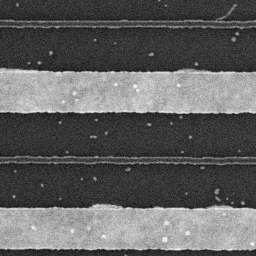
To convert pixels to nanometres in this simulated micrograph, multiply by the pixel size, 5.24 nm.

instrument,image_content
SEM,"lines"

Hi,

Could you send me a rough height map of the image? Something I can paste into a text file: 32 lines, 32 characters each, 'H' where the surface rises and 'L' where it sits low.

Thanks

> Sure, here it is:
LLLLLLLLLLLLLLLLLLLLLLLLLLLLLLLL
LLLLLLLLLLLLLLLLLLLLLLLLLLLLLLLL
LLLLLLLLLLLLLLLLLLLLLLLLLLLLLLLL
LLLLLLLLLLLLLLLLLLLLLLLLLLLLLLHL
LLLLLLLLLLLLLLLLLLLLLLLLLLLLLLLL
LLLLLLLLLLLLLLLLLLLLLLLLLLLLLLLL
LLLLLLLLLLLLLLLLLLLLLLLLLLLLLLLL
LLLLLLLLLLLLLLLLLLLLLLLLLLLLLLLL
LLLLLLLLLLLLLLLLLLLLLLLLLLLLLLLL
HHHHHHHHHHHHHHHHHHHHHHHHHHHHHHHH
HHHHHHHHHHHHHHHHHHHHHHHHHHHHHHHH
HHHHHHHHHHHHHHHHHHHHHHHHHHHHHHHH
HHHHHHHHHHHHHHHHHHHHHHHHHHHHHHHH
HHHHHHHHHHHHHHHHHHHHHHHHHHHHHHHH
LLLLLLLLLLLLLLLLLLLLLLLLLLLLLLLL
LLLLLLLLLLLLLLLLLLLLLLLLLLLLLLLL
LLLLLLLLLLLLLLLLLLLLLLLLLLLLLLLL
LLLLLLLLLLLLLLLLLLLLLLLLLLLLLLLL
LLLLLLLLLLLLLLLLLLLLLLLLLLLLLLLL
LLLLLLLLLLLLLLLLLLLLLLLLLLLLLLLL
LLLLLLLLLLLLLLLLLLLLLLLLHHLHHLLL
LLLLLLLLLLLLLLLLLLLLLLLLLLLLLLLL
LLLLLLLLLLLLLLLLLLLLLLLLLLLLLLLL
LLLLLLLLLLLLLLLLLLLLLLLLLLLLLLLL
LLLLLLLLLLLLLLLLLLLLLLLLLLLLLLLL
LLLLLLLLLLLLLLLLLLLLLLLLLLLLLLLL
HHHHHHHHHHHHHHHHHHHHHHHHHHHHHHHH
HHHHHHHHHHHHHHHHHHHHHHHHHHHHHHHH
HHHHHHHHHHHHHHHHHHHHHHHHHHHHHHHH
HHHHHHHHHHHHHHHHHHHHHHHHHHHHHHHH
HHHHHHHHHHHHHHHHHHHHHHHHHHHHHHHH
LLLLLLLLLLLLLLLLLLLLLLLLLLLLLLLL